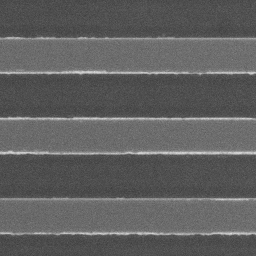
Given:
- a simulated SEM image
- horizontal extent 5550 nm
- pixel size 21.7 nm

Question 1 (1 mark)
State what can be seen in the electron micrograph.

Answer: lines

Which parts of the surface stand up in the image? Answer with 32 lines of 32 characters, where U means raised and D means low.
DDDDDDDDDDDDDDDDDDDDDDDDDDDDDDDD
DDDDDDDDDDDDDDDDDDDDDDDDDDDDDDDD
DDDDDDDDDDDDDDDDDDDDDDDDDDDDDDDD
DDDDDDDDDDDDDDDDDDDDDDDDDDDDDDDD
DDDDDDDDDDDDDDDDDDDDDDDDDDDDDDDD
UUUUUUUUUUUUUUUUUUUUUUUUUUUUUUUU
UUUUUUUUUUUUUUUUUUUUUUUUUUUUUUUU
UUUUUUUUUUUUUUUUUUUUUUUUUUUUUUUU
UUUUUUUUUUUUUUUUUUUUUUUUUUUUUUUU
DDDDDDDDDDDDDDDDDDDDDDDDDDDDDDDD
DDDDDDDDDDDDDDDDDDDDDDDDDDDDDDDD
DDDDDDDDDDDDDDDDDDDDDDDDDDDDDDDD
DDDDDDDDDDDDDDDDDDDDDDDDDDDDDDDD
DDDDDDDDDDDDDDDDDDDDDDDDDDDDDDDD
DDDDDDDDDDDDDDDDDDDDDDDDDDDDDDDD
UUUUUUUUUUUUUUUUUUUUUUUUUUUUUUUU
UUUUUUUUUUUUUUUUUUUUUUUUUUUUUUUU
UUUUUUUUUUUUUUUUUUUUUUUUUUUUUUUU
UUUUUUUUUUUUUUUUUUUUUUUUUUUUUUUU
DDDDDDDDDDDDDDDDDDDDDDDDDDDDDDDD
DDDDDDDDDDDDDDDDDDDDDDDDDDDDDDDD
DDDDDDDDDDDDDDDDDDDDDDDDDDDDDDDD
DDDDDDDDDDDDDDDDDDDDDDDDDDDDDDDD
DDDDDDDDDDDDDDDDDDDDDDDDDDDDDDDD
DDDDDDDDDDDDDDDDDDDDDDDDDDDDDDDD
UUUUUUUUUUUUUUUUUUUUUUUUUUUUUUUU
UUUUUUUUUUUUUUUUUUUUUUUUUUUUUUUU
UUUUUUUUUUUUUUUUUUUUUUUUUUUUUUUU
UUUUUUUUUUUUUUUUUUUUUUUUUUUUUUUU
DDDDDDDDDDDDDDDDDDDDDDDDDDDDDDDD
DDDDDDDDDDDDDDDDDDDDDDDDDDDDDDDD
DDDDDDDDDDDDDDDDDDDDDDDDDDDDDDDD